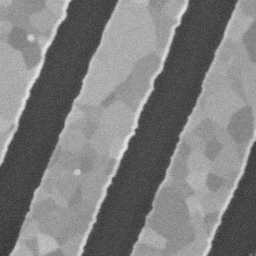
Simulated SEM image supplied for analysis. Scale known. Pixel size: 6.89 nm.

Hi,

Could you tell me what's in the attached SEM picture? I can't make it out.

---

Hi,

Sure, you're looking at lines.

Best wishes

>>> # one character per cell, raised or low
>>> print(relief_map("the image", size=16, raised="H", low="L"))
HHHHLLLHHHHHLLLH
HHHHLLLHHHHLLLHH
HHHLLLHHHHHLLLHH
HHHLLLHHHHLLLHHH
HHLLLHHHHHLLLHHH
HHLLLHHHHHLLLHHH
HHLLLHHHHLLLHHHH
HLLLHHHHHLLLHHHH
HLLLHHHHLLLHHHHH
LLLHHHHHLLLHHHHH
LLLHHHHLLLLHHHHL
LLLHHHHLLLHHHHHL
LLHHHHLLLLHHHHLL
LLHHHHLLLHHHHHLL
LHHHHHLLLHHHHLLL
LHHHHLLLHHHHHLLL